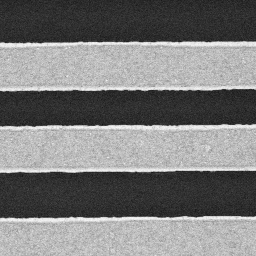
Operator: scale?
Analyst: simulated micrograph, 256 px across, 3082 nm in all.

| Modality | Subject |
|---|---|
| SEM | lines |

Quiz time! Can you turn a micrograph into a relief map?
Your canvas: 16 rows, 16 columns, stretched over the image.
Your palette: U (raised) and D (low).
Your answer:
DDDDDDDDDDDDDDDD
DDDDDDDDDDDDDDDD
DDDDDDDDDDDDDDDD
UUUUUUUUUUUUUUUU
UUUUUUUUUUUUUUUU
UUUUUUUUUUUUUUUU
DDDDDDDDDDDDDDDD
DDDDDDDDDDDDDDDD
UUUUUUUUUUUUUUUU
UUUUUUUUUUUUUUUU
UUUUUUUUUUUUUUUU
DDDDDDDDDDDDDDDD
DDDDDDDDDDDDDDDD
DDDDDDDDDDDDDDDD
UUUUUUUUUUUUUUUU
UUUUUUUUUUUUUUUU